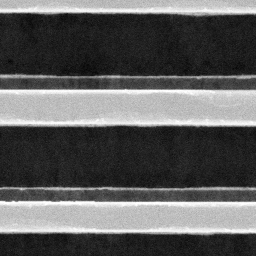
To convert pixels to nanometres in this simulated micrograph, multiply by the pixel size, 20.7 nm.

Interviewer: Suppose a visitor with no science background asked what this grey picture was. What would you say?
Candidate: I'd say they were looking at lines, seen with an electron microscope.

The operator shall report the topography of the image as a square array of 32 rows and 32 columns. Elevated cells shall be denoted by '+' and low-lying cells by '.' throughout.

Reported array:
++++++++++++++++++++++++++++++++
..................+..+++++++++++
................................
................................
................................
................................
................................
................................
................................
................................
++++++++++++++++++++++++++++++++
++++++++++++++++++++++++++++++++
++++++++++++++++++++++++++++++++
++++++++++++++++++++++++++++++++
++++++++++++++++++++++++++++++++
.................++...++++++++++
................................
................................
................................
................................
................................
................................
................................
................................
++++++++++++++++++++++++++++++++
++++++++++++++++++++++++++++++++
++++++++++++++++++++++++++++++++
++++++++++++++++++++++++++++++++
++++++++++++++++++++++++++++++++
................................
................................
................................